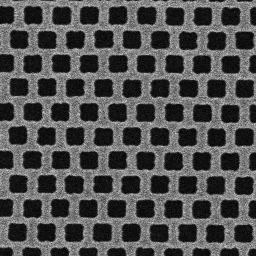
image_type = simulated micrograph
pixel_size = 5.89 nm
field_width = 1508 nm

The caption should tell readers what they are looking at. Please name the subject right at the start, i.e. a regular array of holes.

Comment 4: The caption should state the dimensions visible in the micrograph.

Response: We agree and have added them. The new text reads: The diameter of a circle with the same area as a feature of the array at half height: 118 nanometres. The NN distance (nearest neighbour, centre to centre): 27.5 pixels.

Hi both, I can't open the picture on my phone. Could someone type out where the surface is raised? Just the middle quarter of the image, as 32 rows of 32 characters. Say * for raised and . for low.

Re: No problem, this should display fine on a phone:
..**.....**.....**.....**.....**
..**....***.....**.....**.....**
********************************
********************************
*....***....***....***....***...
.....***....***....***....***...
.....***....***....***....***...
.....***....***....***....***...
********************************
********************************
.***.....**.....**.....**.....**
.***.....**.....**.....**.....**
.***.....**.....**.....**.....**
.***....***.....**.....**.....**
*********************.**********
********************************
*....***....***....***....***...
.....**.....***....***....***...
.....**.....***....***....***...
*....**.....***....***.....*....
********.****************.***...
********************************
.***.....**.....**.....**....***
..**.....**.....**.....**.....**
..**.....**.....**.....**.....**
.***.....**.....**.....**.....**
*******************...***....***
********************************
.....**.....***....***....***...
.....**.....**.....***....***...
.....**.....**.....***....**....
.....**.....**.....**.....**....